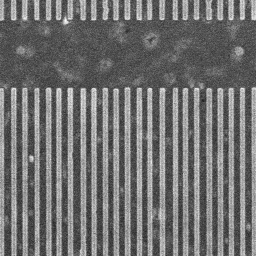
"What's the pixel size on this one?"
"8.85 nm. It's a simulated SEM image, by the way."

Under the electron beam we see parallel lines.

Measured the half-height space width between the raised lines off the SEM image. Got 61.9 nm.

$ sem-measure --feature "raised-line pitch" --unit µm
0.101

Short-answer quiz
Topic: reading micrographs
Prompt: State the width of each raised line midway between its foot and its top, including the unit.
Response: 0.0398 um